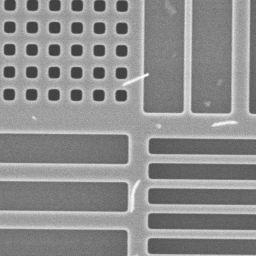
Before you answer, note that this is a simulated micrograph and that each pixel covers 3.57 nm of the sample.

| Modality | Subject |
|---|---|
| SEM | groups of lines, slits or small figures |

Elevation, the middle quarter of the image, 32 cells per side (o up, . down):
oooooooooooooooooooo..........oo
oo..oooo..ooo...oooo..........oo
oo...oo...ooo...oooo..........oo
oo..oooo..ooo..ooooo..........oo
oooooooooooooooooooo..........oo
oooooooooooooooooooo..........oo
oo..oooo..ooo..ooooo..........oo
oo...oo...ooo...oooo..........oo
oo..ooo...ooo...oooo..........oo
oooooooooooooo.ooooo..........oo
oooooooooooooooooooo..........oo
oooooooooooooooooooo..........oo
oooooooooooooooooooooooooooooooo
oooooooooooooooooooooooooooooooo
oooooooooooooooooooooooooooooooo
oooooooooooooooooooooooooooooooo
oooooooooooooooooooooooooooooooo
............oooooooooooooooooooo
................oooooooooooooooo
................ooooo...........
................ooooo...........
................ooooo...........
................oooooo..........
................oooooooooooooooo
................oooooooooooooooo
ooooooooooooooooooooo...........
ooooooooooooooooooooo...........
ooooooooooooooooooooo...........
ooooooooooooooooooooo...........
...............ooooooooooooooooo
................oooooooooooooooo
................ooooo...........